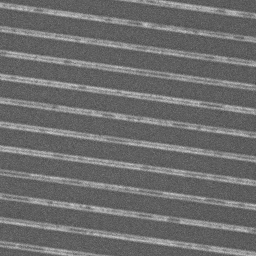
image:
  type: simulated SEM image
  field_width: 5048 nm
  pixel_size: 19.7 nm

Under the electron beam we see parallel lines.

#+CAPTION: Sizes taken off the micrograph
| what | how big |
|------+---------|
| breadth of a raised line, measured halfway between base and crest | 3.84 pixels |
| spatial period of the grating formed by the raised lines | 0.466 um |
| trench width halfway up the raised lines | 0.379 micrometres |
